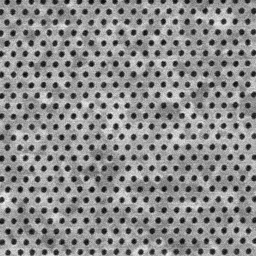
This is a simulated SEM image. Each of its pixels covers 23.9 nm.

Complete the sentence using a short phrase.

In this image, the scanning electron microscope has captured a regular array of holes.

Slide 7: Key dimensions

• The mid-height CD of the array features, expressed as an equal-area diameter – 162 nanometers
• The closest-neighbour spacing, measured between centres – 279 nanometers